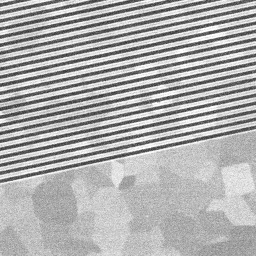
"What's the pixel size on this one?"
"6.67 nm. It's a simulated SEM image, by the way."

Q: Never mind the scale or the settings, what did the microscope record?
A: parallel lines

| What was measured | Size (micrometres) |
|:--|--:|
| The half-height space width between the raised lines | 0.0269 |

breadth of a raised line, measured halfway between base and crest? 22 nm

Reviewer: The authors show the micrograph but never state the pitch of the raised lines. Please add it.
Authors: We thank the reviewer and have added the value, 52.3 nanometers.